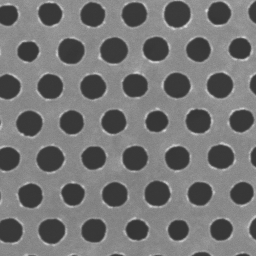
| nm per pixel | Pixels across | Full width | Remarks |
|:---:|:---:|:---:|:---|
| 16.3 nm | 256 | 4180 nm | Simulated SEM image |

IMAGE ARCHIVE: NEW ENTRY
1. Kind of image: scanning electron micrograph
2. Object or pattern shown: a regular array of holes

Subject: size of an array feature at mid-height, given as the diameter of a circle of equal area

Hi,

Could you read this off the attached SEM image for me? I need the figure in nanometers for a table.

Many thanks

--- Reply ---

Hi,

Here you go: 411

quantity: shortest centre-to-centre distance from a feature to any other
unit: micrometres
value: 0.672